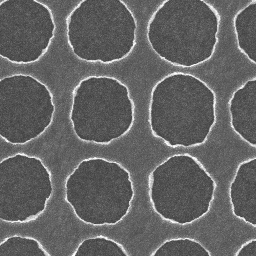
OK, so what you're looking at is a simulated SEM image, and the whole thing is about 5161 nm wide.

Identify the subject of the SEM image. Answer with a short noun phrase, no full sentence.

holes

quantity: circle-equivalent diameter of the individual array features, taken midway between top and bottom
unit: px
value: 64.8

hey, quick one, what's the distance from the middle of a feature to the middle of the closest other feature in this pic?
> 1610 nm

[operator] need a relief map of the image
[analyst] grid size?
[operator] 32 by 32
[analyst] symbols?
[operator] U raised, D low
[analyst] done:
DDDDDUUUUUDDDDDUUUUUUDDDDDUUUUUD
DDDDDDUUUDDDDDDDUUUUDDDDDDDUUUDD
DDDDDDDUUDDDDDDDDUUDDDDDDDDUUDDD
DDDDDDDUUDDDDDDDDUUDDDDDDDDUUUDD
DDDDDDUUUDDDDDDDDUUDDDDDDDDUUUDD
DDDDDDUUUDDDDDDDDUUDDDDDDDDUUUDD
DDDDDUUUUDDDDDDDUUUUDDDDDDUUUUUD
UDDDUUUUUUUDDDUUUUUUUDDDDDUUUUUU
UUUUUUUUUUUUUUUUUUUUUUUUUUUUUUUU
UUDUUUUUUUUUUUUUUUUUUDDDUUUUUUUU
DDDDDUUUUUDDDDDUUUUUDDDDDUUUUUUD
DDDDDDUUUDDDDDDDUUUDDDDDDDUUUUDD
DDDDDDUUUDDDDDDDUUUDDDDDDDDUUDDD
DDDDDDDUUDDDDDDDDUUDDDDDDDDUUDDD
DDDDDDUUUDDDDDDDDUUDDDDDDDDUUDDD
DDDDDDUUUDDDDDDDUUUDDDDDDDDUUDDD
DDDDDUUUUUDDDDDDUUUDDDDDDDUUUUDD
UDDDUUUUUUUDDDUUUUUUUDDDDUUUUUUD
UUUUUUUUUUUUUUUUUUUUUUUUUUUUUUUU
UUDUUUUUUUUUUUUUUUUUUUDUUUUUUUUU
DDDDDUUUUUDDDDDUUUUUDDDDDUUUUUDD
DDDDDDUUUDDDDDDDUUUDDDDDDDUUUUDD
DDDDDDUUUDDDDDDDUUUDDDDDDDUUUDDD
DDDDDDUUDDDDDDDDUUUDDDDDDDDUUDDD
DDDDDDUUDDDDDDDDDUUDDDDDDDDUUDDD
DDDDDDUUUDDDDDDDUUUDDDDDDDUUUDDD
DDDDDUUUUDDDDDDDUUUUDDDDDDUUUDDD
UDDUUUUUUUDDDDDUUUUUUDDDUUUUUUUD
UUUUUUUUUUUUUUUUUUUUUUUUUUUUUUUU
UUUUUUUUUUUUUUUUUUUUUUUUUUUUUUUU
DDDDDUUUUUDDDDDUUUUUDDDDDUUUUUUD
DDDDDDUUUUDDDDDDUUUUDDDDDDUUUUDD